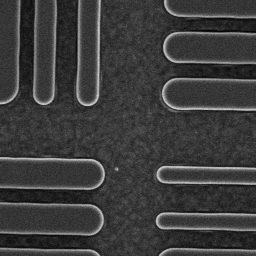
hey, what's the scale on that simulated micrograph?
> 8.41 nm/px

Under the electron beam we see groups of lines, slits or small figures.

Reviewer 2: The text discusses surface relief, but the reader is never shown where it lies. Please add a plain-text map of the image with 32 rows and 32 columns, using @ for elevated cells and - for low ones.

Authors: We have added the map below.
@@--@@@---@@@--------@@@@@@@@@@@
@@--@@@---@@---------@@@@@@@@@@@
@@--@@@---@@--------------------
@@--@@@---@@--------------------
@@--@@@---@@---------@@@@@@@@@@@
@@--@@@---@@---------@@@@@@@@@@@
@@--@@@---@@---------@@@@@@@@@@@
@@--@@@---@@---------@@@@@@@@@@@
@@--@@@---@@--------------------
@@--@@@---@@--------------------
@@--@@@---@@---------@@@@@@@@@@@
@@--@@@---@@--------@@@@@@@@@@@@
@---@@----@@---------@@@@@@@@@@@
----------------------@@@@@@@@@@
--------------------------------
--------------------------------
--------------------------------
--------------------------------
--------------------------------
--------------------------------
@@@@@@@@@@@@--------------------
@@@@@@@@@@@@@-------@@@@@@@@@@@@
@@@@@@@@@@@@@-------@@@@@@@@@@@@
-----@@@@@@@--------------------
--------------------------------
@@@@@---------------------------
@@@@@@@@@@@@@-------------------
@@@@@@@@@@@@@-------@@@@@@@@@@@@
@@@@@@@@@@@@@-------@@@@@@@@@@@@
--------------------------------
--------------------------------
@@@@@@@@@@@@--------@@@@@@@@@@@@